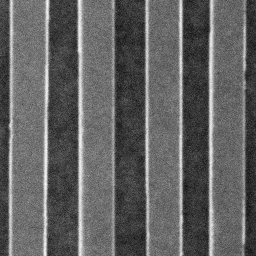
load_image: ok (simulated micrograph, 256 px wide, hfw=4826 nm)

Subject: lines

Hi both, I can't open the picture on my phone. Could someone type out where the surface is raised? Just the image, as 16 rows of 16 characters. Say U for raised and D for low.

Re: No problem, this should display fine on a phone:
DUUDDUUDDUUDDUUD
DUUDDUUDDUUDDUUD
DUUDDUUDDUUDDUUD
DUUDDUUDDUUDDUUD
DUUDDUUDDUUDDUUD
DUUDDUUDDUUDDUUD
DUUDDUUDDUUDDUUD
DUUDDUUDDUUDDUUD
DUUDDUUDDUUDDUUD
DUUDDUUDDUUDDUUD
DUUDDUUDDUUDDUUD
DUUDDUUDDUUDDUUD
DUUDDUUDDUUDDUUD
DUUDDUUDDUUDDUUD
DUUDDUUDDUUDDUUD
DUUDDUUDDUUDDUUD